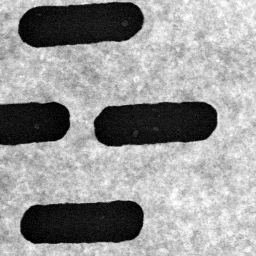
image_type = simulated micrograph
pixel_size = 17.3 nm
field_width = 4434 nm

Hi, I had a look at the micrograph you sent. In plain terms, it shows holes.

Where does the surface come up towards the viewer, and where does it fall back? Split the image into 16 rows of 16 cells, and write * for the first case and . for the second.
**.......*******
*........*******
*.......********
****************
****************
****************
....*****....***
....**........**
....**.......***
****************
****************
****************
****************
*........*******
*........*******
****************